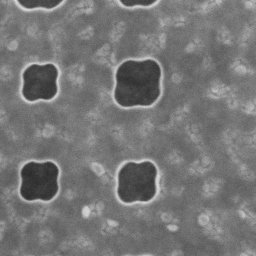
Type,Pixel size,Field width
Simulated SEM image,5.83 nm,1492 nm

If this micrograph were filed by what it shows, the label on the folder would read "holes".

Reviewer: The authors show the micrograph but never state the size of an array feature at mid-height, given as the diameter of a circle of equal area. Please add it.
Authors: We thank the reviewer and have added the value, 244 nanometers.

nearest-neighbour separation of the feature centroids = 570 nanometers